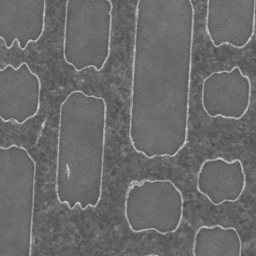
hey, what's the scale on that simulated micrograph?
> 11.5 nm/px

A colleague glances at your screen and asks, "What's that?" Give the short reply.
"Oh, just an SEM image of one or a few lines or trenches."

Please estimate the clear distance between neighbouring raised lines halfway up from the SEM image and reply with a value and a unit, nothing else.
0.511 micrometres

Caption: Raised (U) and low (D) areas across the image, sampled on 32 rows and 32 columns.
DDDDDDUUDDDDDDUUUDDDDDDDUUDDDDDD
DDDDDDUUDDDDDDUUUDDDDDDDUUDDDDDD
DDDDDUUUDDDDDDUUUDDDDDDDUUDDDDDD
DDDDDUUUDDDDDDUUUDDDDDDDUUDDDDDD
DDDDDUUUDDDDDDUUUDDDDDDDUUDDDDDU
UUUUUUUUDDDDDDUUUDDDDDDDUUUDUDDU
UUUUUUUUDDDDDDUUUDDDDDDDUUUUUUUU
UUUUUUUUDDDDDUUUUDDDDDDDUUUUUUUU
UDDDUUUUUDDUDUUUUDDDDDDDUUUUUUUU
DDDDUUUUUUUUUUUUUDDDDDDDUUDDDDDU
DDDDDUUUUUUUUUUUUDDDDDDDUDDDDDDU
DDDDDUUUUDUUUUUUUDDDDDDDUDDDDDDU
DDDDDUUUDDDDDUUUUDDDDDDDUDDDDDDU
DDDDDUUUDDDDDUUUUDDDDDDDUUDDDDDU
DDDDUUUUDDDDDUUUDDDDDDDUUUDUDDUU
UUUUUUUUDDDDDUUUDDDDDDDUUUUUUUUU
UUUUUUUDDDDDDUUUDDDDDDDUUUUUUUUU
UUUUUUUDDDDDDUUUUDDDDDDUUUUUUUUU
UDUUUUUDDDDDDUUUUDDDDDUUUUUUUUUU
DDDDUUUDDDDDDUUUUUUUUUUUUUUUUUUU
DDDDUUUDDDDDDUUUUUUUUUUUUUDDDDUU
DDDDUUUDDDDDDUUUUUUUUUUUUDDDDDUU
DDDDUUUDDDDDDUUUUUUUUUUUUDDDDDUU
DDDDUUUDDDDDDUUUUDDDDDUUUDDDDDUU
DDDDUUUDDDDDUUUUDDDDDDDUUUDDDDUU
DDDDUUUUUUDDUUUUDDDDDDDUUUUUUUUU
DDDDUUUUUUUUUUUUDDDDDDDUUUUUUUUU
DDDDUUUUUUUUUUUUDDDDDDDUUUUUUUUU
DDDDUUUUUUUUUUUUDDDDDDUUUDUUUUUU
DDDDUUUUUUUUUUUUUUUUUUUUUDDDDDUU
DDDDUUUUUUUUUUUUUUUUUUUUDDDDDDUU
DDDDUUUUUUUUUUUUUUUUUUUUDDDDDDUU